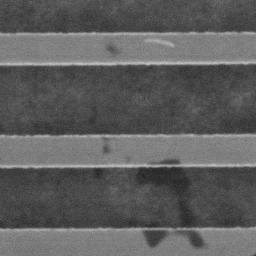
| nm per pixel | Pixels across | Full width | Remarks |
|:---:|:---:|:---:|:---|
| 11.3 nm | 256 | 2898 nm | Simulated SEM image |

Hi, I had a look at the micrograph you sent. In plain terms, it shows lines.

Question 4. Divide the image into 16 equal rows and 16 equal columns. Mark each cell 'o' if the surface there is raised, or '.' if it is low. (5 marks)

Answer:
................
................
oooooooooooooooo
oooooooooooooooo
................
................
................
................
oooooooooooooooo
oooooooooooooooo
................
................
................
................
oooooooooooooooo
oooooooooooooooo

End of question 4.